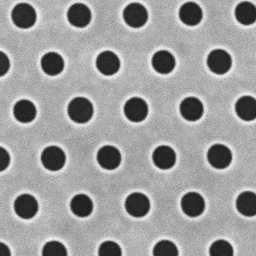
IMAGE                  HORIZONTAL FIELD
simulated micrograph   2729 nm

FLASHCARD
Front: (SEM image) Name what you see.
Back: a regular array of holes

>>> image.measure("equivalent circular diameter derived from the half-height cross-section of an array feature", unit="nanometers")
273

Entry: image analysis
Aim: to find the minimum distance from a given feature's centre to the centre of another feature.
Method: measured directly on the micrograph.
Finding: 583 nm